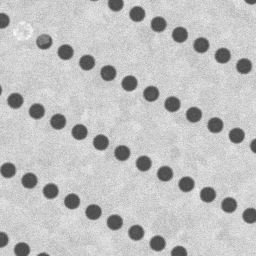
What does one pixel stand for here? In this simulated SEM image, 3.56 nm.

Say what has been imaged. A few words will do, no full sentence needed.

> a regular array of holes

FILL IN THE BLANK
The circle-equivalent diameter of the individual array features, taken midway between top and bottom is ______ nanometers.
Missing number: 57.8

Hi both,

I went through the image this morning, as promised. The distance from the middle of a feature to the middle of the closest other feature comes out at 84.2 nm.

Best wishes